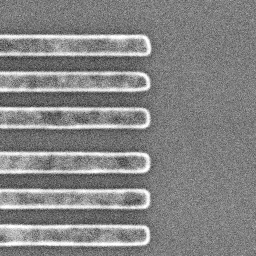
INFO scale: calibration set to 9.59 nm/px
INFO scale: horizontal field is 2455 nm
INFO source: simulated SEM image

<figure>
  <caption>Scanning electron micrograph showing wiring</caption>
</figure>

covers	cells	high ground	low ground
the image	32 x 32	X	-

--------------------------------
--------------------------------
--------------------------------
--------------------------------
--------------------------------
XXXXXXXXXXXXXXXXXXX-------------
XXXXXXXXXXXXXXXXXXX-------------
--------------------------------
--------------------------------
XXXXXXXXXXXXXXXXXX--------------
XXXXXXXXXXXXXXXXXXX-------------
--------------------------------
--------------------------------
--------------------------------
XXXXXXXXXXXXXXXXXXX-------------
XXXXXXXXXXXXXXXXXX--------------
--------------------------------
--------------------------------
--------------------------------
XXXXXXXXXXXXXXXXXX--------------
XXXXXXXXXXXXXXXXXXX-------------
XXX-----------------------------
--------------------------------
--------------------------------
XXXXXXXXXXXXXXXXXXX-------------
XXXXXXXXXXXXXXXXXX--------------
--------------------------------
--------------------------------
XXXXXXXXXXXXXXXXXX--------------
XXXXXXXXXXXXXXXXXXX-------------
XXXXXXXXXXXXXXXXXX--------------
--------------------------------